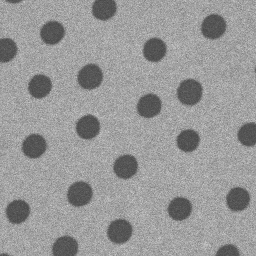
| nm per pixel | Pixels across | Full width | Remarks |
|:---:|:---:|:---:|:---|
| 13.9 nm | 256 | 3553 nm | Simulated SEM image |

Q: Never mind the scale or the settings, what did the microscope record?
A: a regular array of holes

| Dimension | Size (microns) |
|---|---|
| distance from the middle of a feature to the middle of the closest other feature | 0.751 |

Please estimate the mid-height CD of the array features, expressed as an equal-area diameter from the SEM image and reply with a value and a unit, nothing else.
338 nm